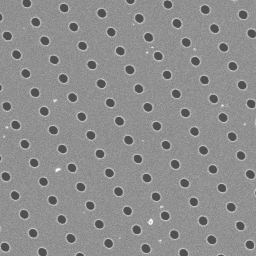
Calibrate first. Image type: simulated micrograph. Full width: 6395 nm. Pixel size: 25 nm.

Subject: a regular array of holes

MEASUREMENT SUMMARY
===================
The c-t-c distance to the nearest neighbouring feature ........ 519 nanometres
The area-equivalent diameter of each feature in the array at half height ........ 216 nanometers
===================